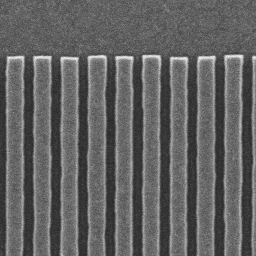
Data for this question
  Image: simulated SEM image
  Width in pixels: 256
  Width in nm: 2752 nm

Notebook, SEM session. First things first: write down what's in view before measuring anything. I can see parallel lines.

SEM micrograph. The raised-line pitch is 0.293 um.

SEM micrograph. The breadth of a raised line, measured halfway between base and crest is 182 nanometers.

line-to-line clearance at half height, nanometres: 112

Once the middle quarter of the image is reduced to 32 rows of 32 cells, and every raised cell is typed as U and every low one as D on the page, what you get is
UUUDDDUUUUUDDUUUUDDDUUUUDDDUUUUD
UUUDDDUUUUUDDUUUUDDDUUUUDDDUUUUD
UUUDDDUUUUDDDUUUUDDDUUUUDDDUUUUD
UUUUDDUUUUUDDUUUUDDDUUUUDDDUUUUD
UUUUDDUUUUDDDUUUUDDDUUUUDDDUUUUD
UUUUDDUUUUDDDUUUUDDDUUUUDDDUUUUD
UUUDDDUUUUDDDUUUUDDDUUUUDDDUUUUD
UUUDDDUUUUDDDUUUUDDDUUUUDDDUUUUD
UUUUDDUUUUDDDUUUUDDDUUUUDDDUUUUD
UUUUDDUUUUDDDUUUUDDDUUUUDDDUUUUD
UUUUDDUUUUDDDUUUUDDDUUUUDDDUUUUD
UUUDDDUUUUDDDUUUUDDDUUUUDDDUUUUD
UUUUDDUUUUDDDUUUUDDDUUUUDDDUUUUD
UUUDDDUUUUDDDUUUUDDDUUUUDDDUUUUD
UUUDDDUUUUDDDUUUUDDDUUUUDDDUUUUD
UUUDDDUUUUDDDUUUUDDDUUUUDDDUUUUD
UUUDDDUUUUDDDUUUUDDDUUUUDDDUUUUD
UUUDDDUUUUDDDUUUUDDDUUUUDDDUUUUD
UUUDDDUUUUDDDUUUUDDDUUUUDDDUUUUD
UUUDDDUUUUDDDUUUUDDDUUUUDDDUUUUD
UUUDDDUUUUDDDUUUUDDDUUUUDDDUUUUD
UUUDDDUUUUDDDUUUUDDDUUUUDDDUUUUD
UUUDDDUUUUDDDUUUUDDDUUUUDDDUUUUD
UUUDDDUUUUDDDUUUUDDDUUUUDDDUUUUD
UUUDDDUUUUDDDUUUUDDDUUUUDDDUUUUD
UUUDDDUUUUDDDUUUUDDDUUUUDDDUUUUD
UUUDDDUUUUDDDUUUUDDDUUUUDDDUUUUD
UUUDDDUUUUDDDUUUUDDDUUUUDDDUUUUD
UUUDDDUUUUDDDUUUUDDDUUUUDDDUUUUD
UUUDDDUUUUDDDUUUUDDDUUUUDDDUUUUD
UUUDDDUUUUDDDUUUUDDDUUUUDDDUUUUD
UUUDDDUUUUDDDUUUUDDDUUUUDDDUUUUD